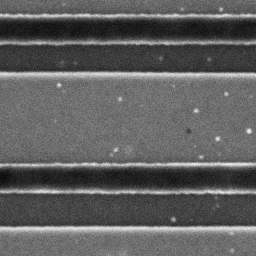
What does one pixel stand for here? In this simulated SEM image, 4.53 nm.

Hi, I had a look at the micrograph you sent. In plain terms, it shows lines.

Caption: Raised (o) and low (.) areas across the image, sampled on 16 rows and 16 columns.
oooooooooooooooo
oooooooooooooooo
oooooooooooooooo
................
................
oooooooooooooooo
oooooooooooooooo
oooooooooooooooo
oooooooooooooooo
oooooooooooooooo
oooooooooooooooo
oooooooooooooooo
................
................
oooooooooooooooo
oooooooooooooooo